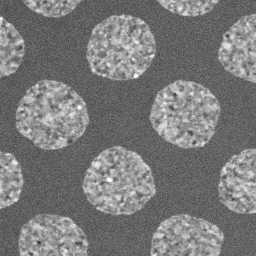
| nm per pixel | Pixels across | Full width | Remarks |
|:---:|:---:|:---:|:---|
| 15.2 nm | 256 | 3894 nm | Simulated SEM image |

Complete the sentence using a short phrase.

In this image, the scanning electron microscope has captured raised bodies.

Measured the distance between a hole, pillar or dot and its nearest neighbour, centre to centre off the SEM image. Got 1.42 microns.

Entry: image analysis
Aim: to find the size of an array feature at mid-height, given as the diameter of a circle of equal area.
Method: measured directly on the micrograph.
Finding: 1.02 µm